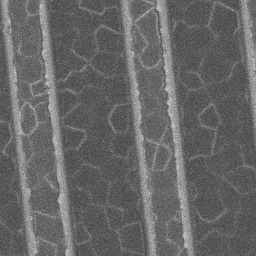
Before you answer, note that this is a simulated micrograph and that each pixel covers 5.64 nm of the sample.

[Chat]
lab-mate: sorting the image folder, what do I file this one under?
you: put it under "one or a few lines or trenches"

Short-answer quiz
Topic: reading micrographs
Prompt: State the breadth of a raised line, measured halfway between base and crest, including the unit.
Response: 224 nm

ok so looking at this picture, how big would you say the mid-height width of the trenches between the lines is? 448 nm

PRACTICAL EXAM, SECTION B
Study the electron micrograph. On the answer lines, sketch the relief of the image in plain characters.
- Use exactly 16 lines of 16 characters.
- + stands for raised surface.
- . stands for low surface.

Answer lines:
+++.....++.....+
+++.....++.....+
+++.....++.....+
.++.....+++.....
.++.....+++.....
.++.....+++.....
.++.....+++.....
.+++.....++.....
.+++.....++.....
.+++.....++.....
.+++.....++.....
.+++.....++.....
..++.....+++....
..++.....+++....
..++.....+++....
..++.....+++....